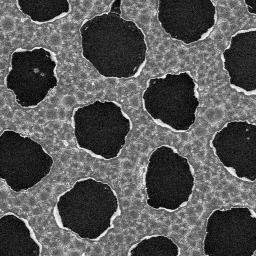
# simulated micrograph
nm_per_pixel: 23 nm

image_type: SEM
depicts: holes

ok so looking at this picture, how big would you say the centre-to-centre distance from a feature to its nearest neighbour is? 1.81 microns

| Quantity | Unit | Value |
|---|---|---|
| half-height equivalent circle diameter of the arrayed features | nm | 1280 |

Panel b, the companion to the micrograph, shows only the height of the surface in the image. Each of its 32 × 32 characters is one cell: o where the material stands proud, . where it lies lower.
oo.......ooooo.ooooo.......oooo.
ooo.....ooooo..ooooo.......oooo.
oooo...oooo.....oooo.......ooooo
oooooooooo.......ooo......oooooo
oooooooooo........ooo.....ooo...
oooooooooo........ooooooooooo...
oo....oooo........oooooooooo....
o......oooo.......oooooooooo....
o......ooooo......oooooooooo....
o......oooooo....oooo...ooooo...
o......ooooooooooo......ooooo...
oo....oooooooooooo......ooooooo.
oo...ooooooooooooo.......ooooooo
oooooooooo.....ooo.......ooooooo
ooooooooo.......ooo.....oooooooo
ooooooooo.......oooo....oooo...o
o.ooooooo.......ooooooooooo.....
....oooooo......ooooooooooo.....
.....ooooo.....ooooo.oooooo.....
......oooooo...oooo....oooo.....
.......oooooooooooo.....oooo....
......oooooooooooo......ooooo...
.....ooooo..oooooo......ooooooo.
o...ooooo.....oooo......oooooooo
oooooooo.......ooo......oooooooo
ooooooo........oooo....ooooooooo
ooooooo........oooooooooooo....o
...oooo.......oooooooooooo......
....oooo......oooooooooooo......
....oooooo..ooooooo.oooooo......
.....oooooooooooo.....ooo.......
.....ooooooooooo......oooo......